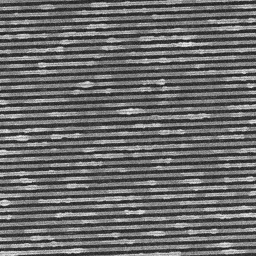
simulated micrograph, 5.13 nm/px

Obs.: parallel lines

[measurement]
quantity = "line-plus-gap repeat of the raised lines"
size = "0.0369 micrometres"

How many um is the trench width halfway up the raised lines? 0.0205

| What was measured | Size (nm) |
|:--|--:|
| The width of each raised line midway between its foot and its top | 16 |